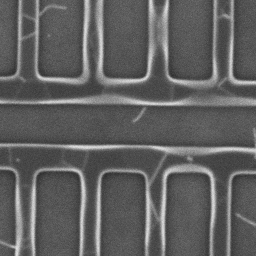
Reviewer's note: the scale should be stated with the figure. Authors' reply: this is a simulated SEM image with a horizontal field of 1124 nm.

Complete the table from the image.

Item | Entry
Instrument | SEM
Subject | groups of lines, slits or small figures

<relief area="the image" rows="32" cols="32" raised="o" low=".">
..ooo......oo......oo......oo...
..ooo......o.......oo......oo...
..ooo......o.......oo......oo...
..ooo......oo......o.......oo...
..ooo......oo......o.......oo...
..ooo......oo......oo......oo...
..ooo......oo......oo......oo...
..ooo......oo......oo......oo...
..ooo......oo......oo......oo...
..ooo......oo.....ooo......oo...
oooooooooooooooooooooooo..oooooo
oooooooooooooooooooooooooooooooo
ooooooooooo....oooooooooo..ooooo
................................
................................
................................
................................
................................
oooooooooooooooooooo............
oooooooooooooooooooooooooooooooo
oooooooooooooooooooooooooooooooo
..ooo.....ooo....oooo.....oooooo
..oo......ooo.....ooo.....ooo...
..oo......oo......ooo......oo...
..oo.......o......ooo......oo...
..oo......oo.......oo......oo...
..oo......oo.......o.......oo...
..oo......oo.......o.......oo...
..oo......oo......oo......ooo...
..oo......oo......oo......ooo...
..oo......oo......oo......ooo...
..oo......oo......oo......ooo...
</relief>